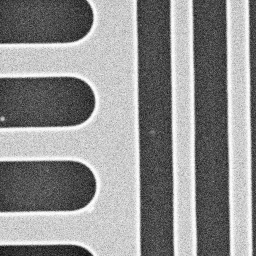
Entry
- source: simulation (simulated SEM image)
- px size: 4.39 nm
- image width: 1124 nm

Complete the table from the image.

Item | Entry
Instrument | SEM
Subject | groups of lines, slits or small figures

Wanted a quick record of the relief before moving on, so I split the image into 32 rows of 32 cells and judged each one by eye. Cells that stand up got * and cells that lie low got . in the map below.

...........******....***....***.
............*****....***....***.
............*****....***....***.
...........******....***.....**.
...........******....***.....**.
......***********.....**.....**.
*****************.....**.....**.
*****************.....**.....**.
*****************.....**.....**.
****.....********.....**.....**.
...........******.....**.....**.
............*****.....**.....**.
............*****.....**.....**.
............*****.....**.....**.
...........******.....**.....**.
..........*******.....**.....**.
*****************.....**.....**.
*****************.....**.....**.
*****************.....**.....**.
*****************.....**.....**.
...........******.....**.....**.
............*****.....**.....**.
............*****.....**.....**.
............*****.....**.....**.
............*****.....**.....**.
...........******.....**.....**.
......***********.....**.....**.
*****************.....**.....**.
*****************.....**.....**.
*****************.....**.....**.
**.......********.....**.....**.
...........******.....**.....**.